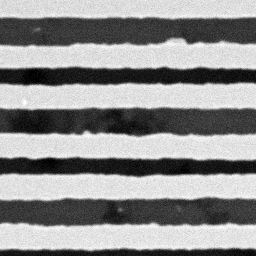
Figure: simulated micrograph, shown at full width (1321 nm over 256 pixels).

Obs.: lines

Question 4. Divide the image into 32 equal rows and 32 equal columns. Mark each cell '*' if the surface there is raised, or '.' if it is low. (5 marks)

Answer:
********************************
********************************
................................
................................
................................
....................**.....*....
********************************
********************************
......................**....*.**
................................
...............**..*..*...*..***
********************************
********************************
***********.*.....*....*****.***
................................
................................
................................
********************************
********************************
********************************
................................
................................
********************************
********************************
********************************
................................
................................
................................
********************************
********************************
********************************
................................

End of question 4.